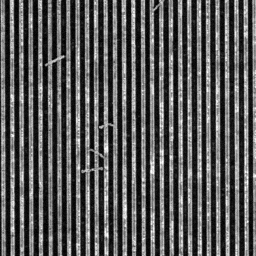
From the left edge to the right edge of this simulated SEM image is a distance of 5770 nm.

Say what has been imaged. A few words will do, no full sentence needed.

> parallel lines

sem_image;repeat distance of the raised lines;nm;211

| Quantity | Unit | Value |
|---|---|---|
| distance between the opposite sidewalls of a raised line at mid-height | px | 2.87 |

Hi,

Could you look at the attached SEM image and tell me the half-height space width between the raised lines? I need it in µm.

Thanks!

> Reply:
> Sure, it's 0.146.